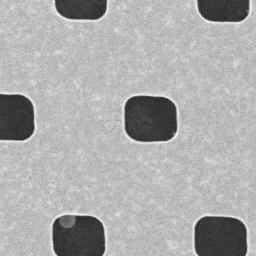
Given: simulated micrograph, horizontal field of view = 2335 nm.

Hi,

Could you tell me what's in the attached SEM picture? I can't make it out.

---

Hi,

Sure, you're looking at holes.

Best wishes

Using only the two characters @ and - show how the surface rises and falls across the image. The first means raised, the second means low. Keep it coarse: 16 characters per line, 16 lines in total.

@@@@---@@@@@----
@@@@@@@@@@@@@@@@
@@@@@@@@@@@@@@@@
@@@@@@@@@@@@@@@@
@@@@@@@@@@@@@@@@
@@@@@@@@@@@@@@@@
--@@@@@@---@@@@@
--@@@@@@---@@@@@
--@@@@@@---@@@@@
@@@@@@@@@@@@@@@@
@@@@@@@@@@@@@@@@
@@@@@@@@@@@@@@@@
@@@@@@@@@@@@@@@@
@@@@--@@@@@@@@@@
@@@----@@@@@---@
@@@----@@@@@---@